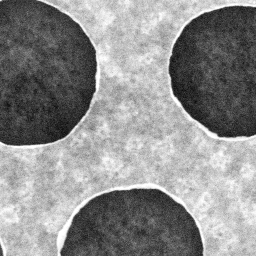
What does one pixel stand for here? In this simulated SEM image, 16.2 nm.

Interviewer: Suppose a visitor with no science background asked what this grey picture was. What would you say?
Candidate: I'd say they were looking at holes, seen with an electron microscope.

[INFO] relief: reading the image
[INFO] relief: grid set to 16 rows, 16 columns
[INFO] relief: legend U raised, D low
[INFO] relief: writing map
DDDDUUUUUUUUUUDD
DDDDDUUUUUUUDDDD
DDDDDDUUUUUDDDDD
DDDDDDUUUUUDDDDD
DDDDDDUUUUUDDDDD
DDDDDDUUUUUDDDDD
DDDDDDUUUUUDDDDD
DDDDDUUUUUUUDDDD
DDDDUUUUUUUUUUDD
UUUUUUUUUUUUUUUU
UUUUUUUUUUUUUUUU
UUUUUUUUUUUUUUUU
UUUUUUDDDDDUUUUU
UUUUUDDDDDDDUUUU
UUUUDDDDDDDDDUUU
UUUUDDDDDDDDDUUU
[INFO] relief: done